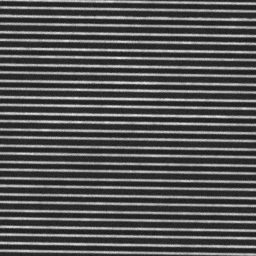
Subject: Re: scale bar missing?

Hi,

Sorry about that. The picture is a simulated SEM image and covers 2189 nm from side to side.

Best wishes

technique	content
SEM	parallel lines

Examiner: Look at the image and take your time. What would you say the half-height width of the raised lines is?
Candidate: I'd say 15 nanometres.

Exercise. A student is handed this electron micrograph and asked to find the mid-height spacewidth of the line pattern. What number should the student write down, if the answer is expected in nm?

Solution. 51.3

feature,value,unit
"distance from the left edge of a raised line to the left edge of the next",69.2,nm